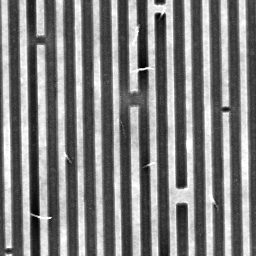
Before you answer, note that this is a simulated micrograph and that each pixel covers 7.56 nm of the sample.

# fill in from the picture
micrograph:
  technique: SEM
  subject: parallel lines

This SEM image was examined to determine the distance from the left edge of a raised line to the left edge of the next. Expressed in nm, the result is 138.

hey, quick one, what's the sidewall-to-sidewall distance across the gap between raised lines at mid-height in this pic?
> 78.4 nm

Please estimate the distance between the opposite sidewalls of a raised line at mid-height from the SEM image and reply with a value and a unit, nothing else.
56.7 nm